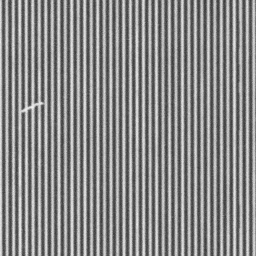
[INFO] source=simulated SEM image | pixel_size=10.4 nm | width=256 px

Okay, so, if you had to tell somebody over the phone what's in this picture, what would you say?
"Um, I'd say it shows parallel lines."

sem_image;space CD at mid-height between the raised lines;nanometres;41.7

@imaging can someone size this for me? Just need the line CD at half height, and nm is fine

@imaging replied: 20.8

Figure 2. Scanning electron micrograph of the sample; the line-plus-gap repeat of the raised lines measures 0.0677 um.